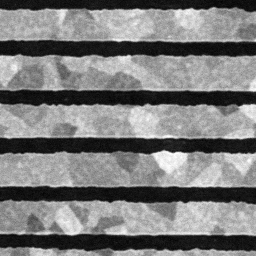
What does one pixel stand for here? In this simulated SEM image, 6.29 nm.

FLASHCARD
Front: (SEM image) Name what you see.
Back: lines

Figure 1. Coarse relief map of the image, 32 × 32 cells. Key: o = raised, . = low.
................................
ooooooooooooooooooooooooooooooo.
oooooooooooooooooooooooooooooooo
oooooooooooooooooooooooooooooooo
oooooooooooooooooooooooooooooooo
................................
................................
oooooooooooooooooooooooooooooooo
oooooooooooooooooooooooooooooooo
oooooooooooooooooooooooooooooooo
oooooooooooooooooooooooooooooooo
................................
................................
oooooooooooooooooooooooooooooooo
oooooooooooooooooooooooooooooooo
oooooooooooooooooooooooooooooooo
oooooooooooooooooooooooooooooooo
................................
................................
oooooooooooooooooooooooooooooooo
oooooooooooooooooooooooooooooooo
oooooooooooooooooooooooooooooooo
oooooooooooooooooooooooooooooooo
................................
................................
ooooooooooooooooooooooooooooooo.
oooooooooooooooooooooooooooooooo
oooooooooooooooooooooooooooooooo
oooooooooooooooooooooooooooooooo
................................
................................
oooooooooooooooooooooooooooooooo